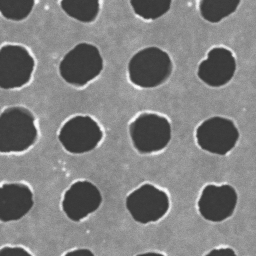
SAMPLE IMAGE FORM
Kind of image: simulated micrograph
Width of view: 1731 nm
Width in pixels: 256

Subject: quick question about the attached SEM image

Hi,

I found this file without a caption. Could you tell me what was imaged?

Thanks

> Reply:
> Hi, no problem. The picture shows a regular array of holes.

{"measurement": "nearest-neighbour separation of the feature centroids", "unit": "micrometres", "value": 0.447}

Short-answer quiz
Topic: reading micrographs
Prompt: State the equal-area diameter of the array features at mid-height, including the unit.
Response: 0.268 um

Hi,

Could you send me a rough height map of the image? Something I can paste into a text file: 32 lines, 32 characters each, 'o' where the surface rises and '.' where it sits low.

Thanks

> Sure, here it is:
....oooo....oooo.....oooo.....oo
....oooo....ooooo....oooo....ooo
o..ooooooo..oooooooooooooo..oooo
oooooooooooooooooooooooooooooooo
oooooooooooooooooooooooooooooooo
oooooooooo.ooooooooooooooooooooo
...oooooo...ooooo....ooooo...ooo
....oooo.....ooo.....ooooo...ooo
....ooo......ooo.....oooo....ooo
....oooo....oooo.....oooo....ooo
...ooooooo.oooooo...oooooo..oooo
oooooooooooooooooooooooooooooooo
oooooooooooooooooooooooooooooooo
o..ooooooooooooooooooooooooooooo
....oooooo.ooooooo..oooooooooooo
....oooo....oooo.....oooo....ooo
.....oo......ooo.....ooo......oo
....ooo......oooo....oooo.....oo
....oooo....ooooo...ooooo....ooo
oooooooooooooooooooooooooooooooo
oooooooooooooooooooooooooooooooo
oooooooooooooooooooooooooooooooo
oooooooooooooooooooooooooooooooo
....ooooo...ooooo..ooooooo...ooo
....oooo.....ooo.....oooo.....oo
....oooo.....ooo.....oooo....ooo
...ooooo....oooo.....oooo....ooo
..ooooooo.ooooooo...oooooo..oooo
oooooooooooooooooooooooooooooooo
oooooooooooooooooooooooooooooooo
oooooooooooooooooooooooooooooooo
...oooooo..ooooooooooooooo...ooo